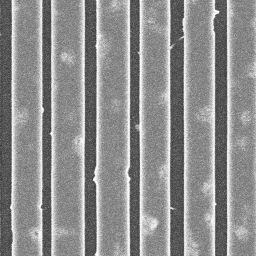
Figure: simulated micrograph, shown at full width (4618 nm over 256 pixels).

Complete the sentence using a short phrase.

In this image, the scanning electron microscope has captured parallel lines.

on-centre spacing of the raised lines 777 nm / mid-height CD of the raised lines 546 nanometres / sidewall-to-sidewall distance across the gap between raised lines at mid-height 232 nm